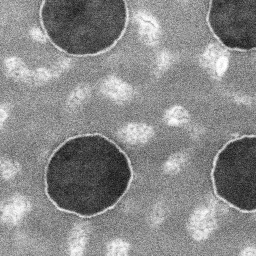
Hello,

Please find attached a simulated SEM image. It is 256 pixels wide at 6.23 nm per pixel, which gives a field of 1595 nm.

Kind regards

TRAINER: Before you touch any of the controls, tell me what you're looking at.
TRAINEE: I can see raised bodies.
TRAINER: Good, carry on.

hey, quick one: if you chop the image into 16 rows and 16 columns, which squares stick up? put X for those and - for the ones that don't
---XXXXX-----XXX
---XXXXX-----XXX
---XXXX-------XX
----------------
----------------
----------------
----------------
----------------
-----X----------
---XXXXX------XX
---XXXXX-----XXX
---XXXXX-----XXX
---XXXX-------XX
-----X----------
----------------
----------------